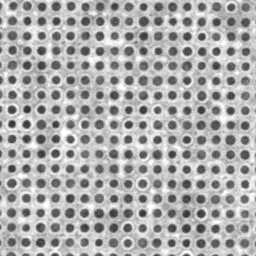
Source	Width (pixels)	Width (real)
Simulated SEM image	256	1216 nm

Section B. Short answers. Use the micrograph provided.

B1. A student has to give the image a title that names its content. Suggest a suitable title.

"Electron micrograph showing a regular array of holes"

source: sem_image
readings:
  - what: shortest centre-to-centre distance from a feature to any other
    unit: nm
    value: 68.5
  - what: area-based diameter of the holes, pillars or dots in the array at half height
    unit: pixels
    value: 9.58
